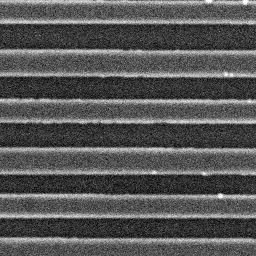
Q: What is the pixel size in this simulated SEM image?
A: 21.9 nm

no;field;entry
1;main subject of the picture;lines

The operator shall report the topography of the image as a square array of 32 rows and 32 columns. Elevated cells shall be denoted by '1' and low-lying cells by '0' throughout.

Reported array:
11111111111111111111111111111111
11111111111111111111111111111111
11111111111111111111111111111111
00000000000000000000000000000000
00000000000000000000000000000000
00000000000000000000000000000000
11111111111111111111111111111111
11111111111111111111111111111111
11111111111111111111111111111111
00000000000011011111111111111111
00000000000000000000000000000000
00000000000000000000000000000000
01010100000000000000000000000000
11111111111111111111111111111111
11111111111111111111111111111111
00000000000000000000000000000000
00000000000000000000000000000000
00000000000000000000000000000000
00000000000000000000000000000000
11111111111111111111111111111111
11111111111111111111111111111111
11111111111111111111111111111111
00000000000000000000000000000000
00000000000000000000000000000000
11111111111111111111111111111111
11111111111111111111111111111111
11111111111111111111111111111111
00000000000000000000000000000000
00000000000000000000000000000000
00000000000000000000000000000000
11111111111111111111111111111111
11111111111111111111111111111111